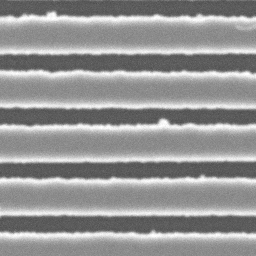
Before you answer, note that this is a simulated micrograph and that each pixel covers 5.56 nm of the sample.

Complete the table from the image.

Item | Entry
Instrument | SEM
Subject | lines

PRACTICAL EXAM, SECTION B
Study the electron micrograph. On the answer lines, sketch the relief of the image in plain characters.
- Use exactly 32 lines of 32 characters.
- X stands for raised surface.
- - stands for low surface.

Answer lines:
--------------------------------
--------------------------------
XXXXXXXXXXXXXXXXXXXXXXXXXXXXXXXX
XXXXXXXXXXXXXXXXXXXXXXXXXXXXXXXX
XXXXXXXXXXXXXXXXXXXXXXXXXXXXXXXX
XXXXXXXXXXXXXXXXXXXXXXXXXXXXXXXX
XXXXXXXXXXXXXXXXXXXXXXXXXXXXXXXX
--------------------------------
--------------------------------
XXXXXXXXXXXXXXXXXXXXXXXXXXXXXXXX
XXXXXXXXXXXXXXXXXXXXXXXXXXXXXXXX
XXXXXXXXXXXXXXXXXXXXXXXXXXXXXXXX
XXXXXXXXXXXXXXXXXXXXXXXXXXXXXXXX
--------XXXXX---XX--XXXXX-X-XXXX
--------------------------------
--------------------X--X--------
XXXXXXXXXXXXXXXXXXXXXXXXXXXXXXXX
XXXXXXXXXXXXXXXXXXXXXXXXXXXXXXXX
XXXXXXXXXXXXXXXXXXXXXXXXXXXXXXXX
XXXXXXXXXXXXXXXXXXXXXXXXXXXXXXXX
--------------------------------
--------------------------------
XXXXX-XXXXX-X-XXXXXXXXXXXXXXXXXX
XXXXXXXXXXXXXXXXXXXXXXXXXXXXXXXX
XXXXXXXXXXXXXXXXXXXXXXXXXXXXXXXX
XXXXXXXXXXXXXXXXXXXXXXXXXXXXXXXX
XXXXXXXXXXXXXXXXXXXXXXXXXXXXXXXX
--------------------------------
--------------------------------
XXXXXXXXXXXXXXXXXXXXXXXXXXXXXXXX
XXXXXXXXXXXXXXXXXXXXXXXXXXXXXXXX
XXXXXXXXXXXXXXXXXXXXXXXXXXXXXXXX